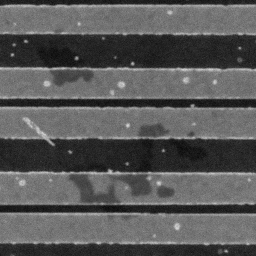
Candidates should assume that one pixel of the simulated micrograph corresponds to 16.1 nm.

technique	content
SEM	lines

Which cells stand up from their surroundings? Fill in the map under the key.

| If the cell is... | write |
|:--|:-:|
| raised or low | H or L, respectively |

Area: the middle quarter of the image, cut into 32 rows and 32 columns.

LLLLLLLLLLLLLLLLLLLLLLLLLLLLLLLL
HHHHHHHHHHHHHHHHHHHHHHHHHHHHHHHH
HHHHHHHHHHHHHHHHHHHHHHHHHHHHHHHH
HHHHHHHHHHHHHHHHHHHHHHHHHHHHHHHH
HHHHHHHHHHHHHHHHHHHHHHHHHHHHHHHH
HHHHHHHHHHHHHHHHHHHHHHHHHHHHHHHH
HHHHHHHHHHHHHHHHHHHHHHHHHHHHHHHH
HHHHHHHHHHHHHHHHHHHHHHHHHHHHHHHH
HHHHHHHHHHHHHHHHHHHHHHHHHHHHHHHH
LLLLLLLLLLLLLLLLLLLLLLLLLLLLLLLL
LLLLLLLLLLLLLLLLLLLLLLLLLLLLLLLL
HHHHHHHHHHHHHHHHHHHHHHHHHHHHHHHH
HHHHHHHHHHHHHHHHHHHHHHHHHHHHHHHH
HHHHHHHHHHHHHHHHHHHHHHHHHHHHHHHH
HHHHHHHHHHHHHHHHHHHHHHHHHHHHHHHH
HHHHHHHHHHHHHHHHHHHHHHHHHHHHHHHH
HHHHHHHHHHHHHHHHHHHHHHHHHHHHHHHH
HHHHHHHHHHHHHHHHHHHHHHHHHHHHHHHH
HHHHHHLLHHHHHHHHHHHHLHHHHHHLHHHH
LLLLLLLLLLLLLLLLLLLLLLLLLLLLLLLL
LLLLLLLLLLLLLLLLLLLLLLLLLLLLLLLL
LLLLLLLLLLLLLLLLLLLLLLLLLLLLLLLL
LLLLLLLLLLLLLLLLLLLLLLLLLLLLLLLL
LLLLLLLLLLLLLLLLLLLLLLLLLLLLLLLL
LLLLLLLLLLLLLLLLLLLLLLLLLLLLLLLL
LLLLLLLLLLLLLLLLLLLLLLLLLLLLLLLL
LLLLLLLLLLLLLLLLLLLLLLLLLLLLLLLL
HHHHHHHHHHHHHHHHHHHHHHHHHHHHHHHH
HHHHHHHHHHHHHHHHHHHHHHHHHHHHHHHH
HHHHHHHHHHHHHHHHHHHHHHHHHHHHHHHH
HHHHHHHHHHHHHHHHHHHHHHHHHHHHHHHH
HHHHHHHHHHHHHHHHHHHHHHHHHHHHHHHH